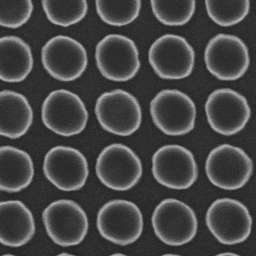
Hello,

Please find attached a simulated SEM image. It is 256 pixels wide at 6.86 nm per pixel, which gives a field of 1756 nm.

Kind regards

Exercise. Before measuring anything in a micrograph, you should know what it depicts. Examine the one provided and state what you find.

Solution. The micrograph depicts a regular array of raised bodies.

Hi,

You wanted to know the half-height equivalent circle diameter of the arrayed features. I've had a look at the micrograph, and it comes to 298 nm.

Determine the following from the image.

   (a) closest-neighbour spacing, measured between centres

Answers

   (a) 370 nm